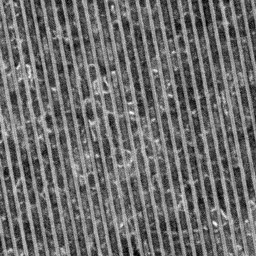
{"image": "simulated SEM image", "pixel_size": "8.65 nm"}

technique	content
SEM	parallel lines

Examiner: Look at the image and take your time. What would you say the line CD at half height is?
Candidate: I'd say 19.2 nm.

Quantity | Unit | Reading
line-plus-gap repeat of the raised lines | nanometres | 89.3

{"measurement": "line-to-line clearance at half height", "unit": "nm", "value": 69.1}